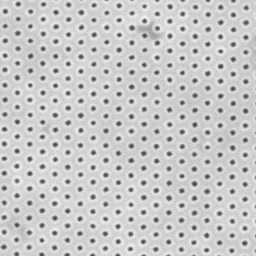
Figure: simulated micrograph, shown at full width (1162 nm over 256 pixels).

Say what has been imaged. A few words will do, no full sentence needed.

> a regular array of holes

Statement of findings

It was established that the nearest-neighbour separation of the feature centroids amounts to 0.065 microns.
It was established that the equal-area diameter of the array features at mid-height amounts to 24 nm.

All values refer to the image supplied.